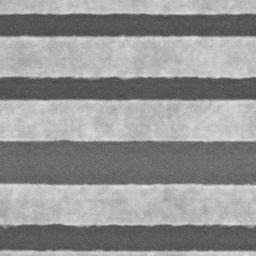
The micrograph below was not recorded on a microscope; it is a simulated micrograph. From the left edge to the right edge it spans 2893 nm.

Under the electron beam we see lines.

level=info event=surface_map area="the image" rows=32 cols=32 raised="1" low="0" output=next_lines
11111111111111111111111111111111
11111111111111111111111111111111
00000000000000000000000000000000
00000000000000000000000000000000
00000000000000000000000000000000
11111111111111111111111111111111
11111111111111111111111111111111
11111111111111111111111111111111
11111111111111111111111111111111
11111111111111111111111111111111
00000000000000000000000000000000
00000000000000000000000000000000
00000000000000000000000000000000
11111111111111111111111111111111
11111111111111111111111111111111
11111111111111111111111111111111
11111111111111111111111111111111
11111111111111111111111111111111
00000000000000000000000000000000
00000000000000000000000000000000
00000000000000000000000000000000
00000000000000000000000000000000
00000000000000000000000000000000
11111111111111111111111111111111
11111111111111111111111111111111
11111111111111111111111111111111
11111111111111111111111111111111
11111111111111111111111111111111
00000000000000000000000000000000
00000000000000000000000000000000
00000000000000000000000000000000
11111111111111111111111111111111